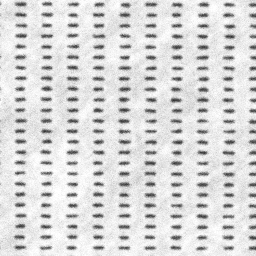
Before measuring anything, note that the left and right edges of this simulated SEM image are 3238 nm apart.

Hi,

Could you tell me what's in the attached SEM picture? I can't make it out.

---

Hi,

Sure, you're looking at a regular array of holes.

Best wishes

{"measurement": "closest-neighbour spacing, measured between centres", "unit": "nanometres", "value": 131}